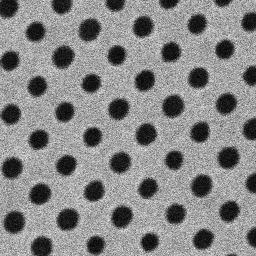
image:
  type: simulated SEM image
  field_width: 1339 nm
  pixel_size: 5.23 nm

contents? a regular array of holes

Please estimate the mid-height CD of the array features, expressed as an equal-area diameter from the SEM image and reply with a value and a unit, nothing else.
115 nm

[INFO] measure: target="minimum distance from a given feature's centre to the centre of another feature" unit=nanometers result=197